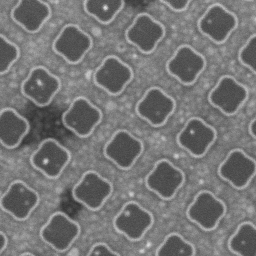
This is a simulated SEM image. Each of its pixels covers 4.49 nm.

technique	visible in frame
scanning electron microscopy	a regular array of raised bodies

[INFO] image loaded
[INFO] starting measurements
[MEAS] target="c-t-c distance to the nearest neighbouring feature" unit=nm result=232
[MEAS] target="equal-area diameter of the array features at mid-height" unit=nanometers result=160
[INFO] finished